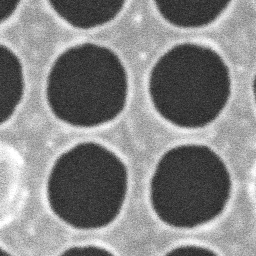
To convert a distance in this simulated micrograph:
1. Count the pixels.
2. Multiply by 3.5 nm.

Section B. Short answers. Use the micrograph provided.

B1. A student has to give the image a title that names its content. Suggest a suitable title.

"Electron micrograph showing holes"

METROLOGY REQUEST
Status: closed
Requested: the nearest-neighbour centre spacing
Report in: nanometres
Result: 352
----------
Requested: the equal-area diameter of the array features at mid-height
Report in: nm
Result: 298